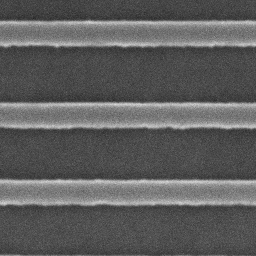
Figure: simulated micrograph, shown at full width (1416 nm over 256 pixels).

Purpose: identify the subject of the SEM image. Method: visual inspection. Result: lines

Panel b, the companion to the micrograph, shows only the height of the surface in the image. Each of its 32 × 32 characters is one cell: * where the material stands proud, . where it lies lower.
................................
................................
................................
********************************
********************************
********************************
................................
................................
................................
................................
................................
................................
................................
********************************
********************************
********************************
................................
................................
................................
................................
................................
................................
................................
********************************
********************************
..............*.........*.......
................................
................................
................................
................................
................................
................................